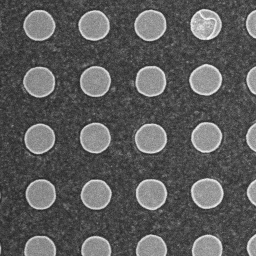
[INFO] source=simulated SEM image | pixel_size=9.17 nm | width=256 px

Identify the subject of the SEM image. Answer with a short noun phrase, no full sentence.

a regular array of raised bodies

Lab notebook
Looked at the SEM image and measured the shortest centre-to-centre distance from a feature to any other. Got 509 nanometres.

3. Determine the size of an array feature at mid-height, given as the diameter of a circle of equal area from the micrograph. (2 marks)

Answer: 279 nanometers